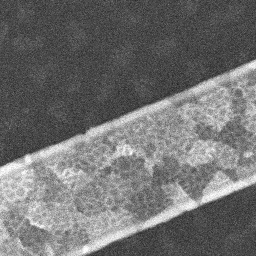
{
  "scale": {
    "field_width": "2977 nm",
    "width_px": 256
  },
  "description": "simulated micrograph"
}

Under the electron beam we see one or a few lines or trenches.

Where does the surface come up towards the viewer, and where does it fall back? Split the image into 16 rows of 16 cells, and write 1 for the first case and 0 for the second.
0000000000000000
0000000000000000
0000000000000000
0000000000000000
0000000000000001
0000000000000111
0000000000111111
0000000011111111
0000011111111111
0001111111111111
0111111111111111
1111111111111110
1111111111111000
1111111111000000
1111111100000000
1111110000000000